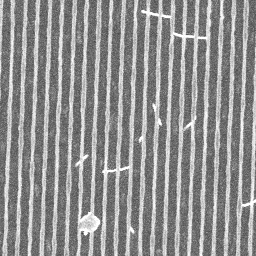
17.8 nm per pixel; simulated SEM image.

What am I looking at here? parallel lines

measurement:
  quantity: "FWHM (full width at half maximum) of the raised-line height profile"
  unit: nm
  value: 49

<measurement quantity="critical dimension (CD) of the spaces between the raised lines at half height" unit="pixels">9.12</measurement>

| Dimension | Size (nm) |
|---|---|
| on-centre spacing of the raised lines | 218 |